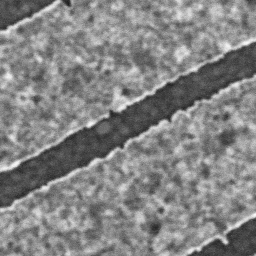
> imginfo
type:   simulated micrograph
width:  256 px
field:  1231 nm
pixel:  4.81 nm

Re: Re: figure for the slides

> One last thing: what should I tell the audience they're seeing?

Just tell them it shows one or a few lines or trenches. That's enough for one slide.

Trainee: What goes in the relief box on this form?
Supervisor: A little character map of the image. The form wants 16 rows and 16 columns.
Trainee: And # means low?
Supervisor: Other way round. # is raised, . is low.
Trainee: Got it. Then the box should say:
...#############
.###############
################
##############..
############....
##########....##
########....####
######.....#####
####.....#######
##.....#########
#....###########
...#############
.###############
################
##############..
############....